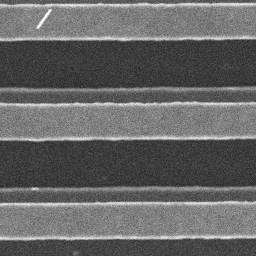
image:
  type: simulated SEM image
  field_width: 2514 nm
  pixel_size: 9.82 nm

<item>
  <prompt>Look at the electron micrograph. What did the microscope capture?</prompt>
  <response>lines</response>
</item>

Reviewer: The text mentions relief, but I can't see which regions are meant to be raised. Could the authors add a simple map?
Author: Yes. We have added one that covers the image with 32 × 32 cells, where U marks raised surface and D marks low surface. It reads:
DDDDDDDDDDDDUDDDDUUDUDUUUUUUUUUU
UUUUUUUUUUUUUUUUUUUUUUUUUUUUUUUU
UUUUUUUUUUUUUUUUUUUUUUUUUUUUUUUU
UUUUUUUUUUUUUUUUUUUUUUUUUUUUUUUU
UUUUUUUUUUUUUUUUUUUUUUUUUUUUUUUU
DDDDDDDDDDDDDDDDDDDDDDDDDDDDDDDD
DDDDDDDDDDDDDDDDDDDDDDDDDDDDDDDD
DDDDDDDDDDDDDDDDDDDDDDDDDDDDDDDD
DDDDDDDDDDDDDDDDDDDDDDDDDDDDDDDD
DDDDDDDDDDDDDDDDDDDDDDDDDDDDDDDD
DDDDDDDDDDDDDDDDDDDDDDDDDDDDDDDD
DDDDDDDDDDDDDDDDDDDDDDDDDDDDDDDD
DDDDDDDDDDDDDDDDDDDDDDDDDDDDDDDD
UUUUUUUUUUUUUUUUUUUUUUUUUUUUUUUU
UUUUUUUUUUUUUUUUUUUUUUUUUUUUUUUU
UUUUUUUUUUUUUUUUUUUUUUUUUUUUUUUU
UUUUUUUUUUUUUUUUUUUUUUUUUUUUUUUU
DDUUUUDDDDDDDDDDDDDDDDDDDDDDDDDD
DDDDDDDDDDDDDDDDDDDDDDDDDDDDDDDD
DDDDDDDDDDDDDDDDDDDDDDDDDDDDDDDD
DDDDDDDDDDDDDDDDDDDDDDDDDDDDDDDD
DDDDDDDDDDDDDDDDDDDDDDDDDDDDDDDD
DDDDDDDDDDDDDDDDDDDDDDDDDDDDDDDD
DDDDDDDDDDDDDDDDDDDDDDDDDDDDDDDD
DDDDDDDDDDDDDDDDDDDDDDDDDDDDDDDD
UUUUUUUUUUUUUUUUUUUUUUUUUUUUUUUU
UUUUUUUUUUUUUUUUUUUUUUUUUUUUUUUU
UUUUUUUUUUUUUUUUUUUUUUUUUUUUUUUU
UUUUUUUUUUUUUUUUUUUUUUUUUUUUUUUU
UUUUUUUUUUUUUUUUUUUUUUUUUUUUUUUU
DDDDDDDDDDDDDDDDDDDDDDDDDDDDDDDD
DDDDDDDDDDDDDDDDDDDDDDDDDDDDDDDD